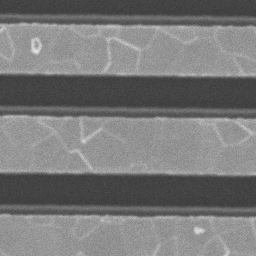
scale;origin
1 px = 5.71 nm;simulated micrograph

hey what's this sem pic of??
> lines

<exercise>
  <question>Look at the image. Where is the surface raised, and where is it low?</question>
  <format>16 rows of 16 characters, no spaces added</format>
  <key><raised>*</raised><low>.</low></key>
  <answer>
................
****************
****************
****************
****************
................
................
****************
****************
****************
****************
................
................
****************
****************
****************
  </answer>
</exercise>